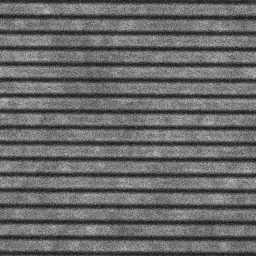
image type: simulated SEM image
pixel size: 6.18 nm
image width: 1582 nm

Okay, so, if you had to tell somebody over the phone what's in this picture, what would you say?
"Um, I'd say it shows parallel lines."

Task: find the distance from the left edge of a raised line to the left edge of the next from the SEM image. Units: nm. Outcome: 97.4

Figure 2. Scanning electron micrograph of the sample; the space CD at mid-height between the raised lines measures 32.4 nm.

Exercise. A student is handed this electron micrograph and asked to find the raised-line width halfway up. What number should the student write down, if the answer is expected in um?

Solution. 0.0648